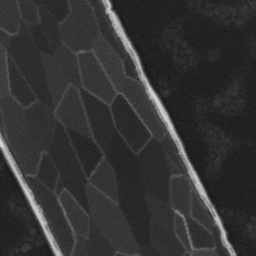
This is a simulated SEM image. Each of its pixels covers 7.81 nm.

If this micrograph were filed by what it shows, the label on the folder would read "one or a few lines or trenches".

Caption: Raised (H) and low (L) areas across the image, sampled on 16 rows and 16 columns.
HHHHHHHLLLLLLLLL
HHHHHHHLLLLLLLLL
HHHHHHHHLLLLLLLL
HHHHHHHHLLLLLLLL
HHHHHHHHHLLLLLLL
HHHHHHHHHLLLLLLL
HHHHHHHHHHLLLLLL
HHHHHHHHHHLLLLLL
HHHHHHHHHHHLLLLL
HHHHHHHHHHHLLLLL
LHHHHHHHHHHHLLLL
LHHHHHHHHHHHLLLL
LLHHHHHHHHHHHLLL
LLHHHHHHHHHHHLLL
LLLHHHHHHHHHHHLL
LLLHHHHHHHHHHHLL